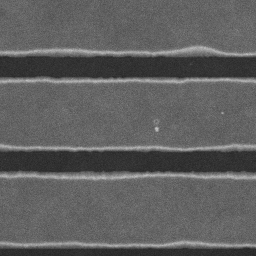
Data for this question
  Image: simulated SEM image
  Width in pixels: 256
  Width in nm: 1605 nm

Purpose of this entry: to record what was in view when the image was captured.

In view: lines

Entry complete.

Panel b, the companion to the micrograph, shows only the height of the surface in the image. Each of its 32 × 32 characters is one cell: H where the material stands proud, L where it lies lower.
HHHHHHHHHHHHHHHHHHHHHHHHHHHHHHHH
HHHHHHHHHHHHHHHHHHHHHHHHHHHHHHHH
HHHHHHHHHHHHHHHHHHHHHHHHHHHHHHHH
HHHHHHHHHHHHHHHHHHHHHHHHHHHHHHHH
HHHHHHHHHHHHHHHHHHHHHHHHHHHHHHHH
HHHHHHHHHHHHHHHHHHHHHHHHHHHHHHHH
HHHHHHHHHHHHHHHHHHHHHHHHHHHHHHHH
LLLLLLLLLLLLLLLLLLLLLLLLLLLLLLLL
LLLLLLLLLLLLLLLLLLLLLLLLLLLLLLLL
LLLLLLLLLLLLLLLLLLLLLLLLLLLLLLLL
HHHHHHHHHHHHHHHHHHHHHHHHHHHHHHHH
HHHHHHHHHHHHHHHHHHHHHHHHHHHHHHHH
HHHHHHHHHHHHHHHHHHHHHHHHHHHHHHHH
HHHHHHHHHHHHHHHHHHHHHHHHHHHHHHHH
HHHHHHHHHHHHHHHHHHHHHHHHHHHHHHHH
HHHHHHHHHHHHHHHHHHHHHHHHHHHHHHHH
HHHHHHHHHHHHHHHHHHHHHHHHHHHHHHHH
HHHHHHHHHHHHHHHHHHHHHHHHHHHHHHHH
HHHHHHHHHHHHHHHHHHHHHHHHHHHHHHHH
LLLLLLLLLLLLLLLLLLLLLLLLLLLLLLLL
LLLLLLLLLLLLLLLLLLLLLLLLLLLLLLLL
LLLLLLLLLLLLLLLLLLLLLLLLLLLLLLLL
HHHHHHHHHHHHHHHHHHHHHHHHHHHHHHHH
HHHHHHHHHHHHHHHHHHHHHHHHHHHHHHHH
HHHHHHHHHHHHHHHHHHHHHHHHHHHHHHHH
HHHHHHHHHHHHHHHHHHHHHHHHHHHHHHHH
HHHHHHHHHHHHHHHHHHHHHHHHHHHHHHHH
HHHHHHHHHHHHHHHHHHHHHHHHHHHHHHHH
HHHHHHHHHHHHHHHHHHHHHHHHHHHHHHHH
HHHHHHHHHHHHHHHHHHHHHHHHHHHHHHHH
HHHHHHHHHHHHHHHHHHHHHHHHHHHHHHHH
LLLLLLLLLLLLLLLLLLLLLLLLLLLLLLLL